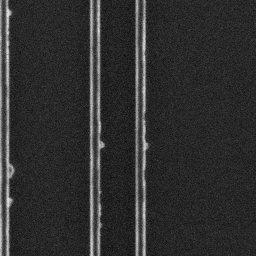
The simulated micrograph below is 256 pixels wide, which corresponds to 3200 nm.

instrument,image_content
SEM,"lines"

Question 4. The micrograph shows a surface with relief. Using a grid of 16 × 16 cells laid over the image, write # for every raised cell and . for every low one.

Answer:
#...............
#...............
#...............
#...............
#...............
#...............
#...............
#...............
#...............
#...............
#...............
#...............
#...............
#...............
#...............
#...............